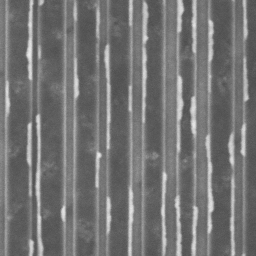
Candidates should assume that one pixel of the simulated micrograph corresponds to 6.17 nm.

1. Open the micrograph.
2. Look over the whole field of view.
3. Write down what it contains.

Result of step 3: parallel lines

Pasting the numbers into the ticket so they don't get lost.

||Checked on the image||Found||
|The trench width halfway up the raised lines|57.1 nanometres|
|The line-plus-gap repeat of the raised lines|208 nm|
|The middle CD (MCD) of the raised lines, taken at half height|156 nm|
